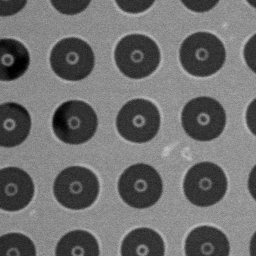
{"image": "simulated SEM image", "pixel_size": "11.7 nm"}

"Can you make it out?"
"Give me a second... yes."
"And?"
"an array of small figures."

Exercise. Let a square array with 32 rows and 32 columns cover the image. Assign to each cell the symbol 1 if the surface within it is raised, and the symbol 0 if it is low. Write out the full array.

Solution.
00011100000111000001111000011110
00111110001111100011111100111111
11111111111111111111111111111111
11111111111111111111111111111111
11111111111111100001111000011110
00011110000111000000111000001100
00001100000011000000110001001100
11001100000011000000110000001100
00001100000011100000111000001110
00011110000111110001111100111111
11111111111111111111111111111111
11111111111111111111111111111111
11111111101111110001111100011110
00011110000011100000111000001110
00001100000011100000110001001110
01001100010011000100111000001110
00001100000011100000111000001110
00011110000111110001111100011111
11111111111111111111111111111111
11111111111111111111111111111111
11111111111111111011111100011111
00011111000011100000111000001110
00001110000011100000111001000110
01001110010001100100111001001110
00001110000011100000111000001110
00001110000011110001111100011111
10111111111111111111111111111111
11111111111111111111111111111111
11111111111111111001111100011111
00011111000011100000111000001110
00001110000011100000011000000110
01000110010001100100011000000110